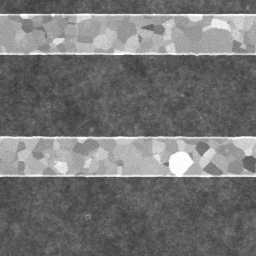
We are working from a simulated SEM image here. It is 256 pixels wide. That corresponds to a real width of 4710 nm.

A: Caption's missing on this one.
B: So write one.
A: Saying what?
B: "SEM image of one or a few lines or trenches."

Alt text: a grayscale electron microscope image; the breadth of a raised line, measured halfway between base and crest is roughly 708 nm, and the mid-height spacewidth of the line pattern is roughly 1540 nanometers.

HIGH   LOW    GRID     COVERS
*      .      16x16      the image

................
****************
****************
................
................
................
................
................
................
****************
****************
................
................
................
................
................